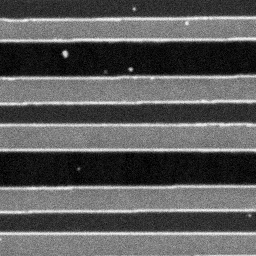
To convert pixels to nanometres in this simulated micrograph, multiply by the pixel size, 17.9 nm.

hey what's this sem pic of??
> lines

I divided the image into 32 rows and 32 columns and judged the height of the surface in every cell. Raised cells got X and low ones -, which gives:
XXXXXXXXXXXXXXXXXXXXXXXXXXXXXXXX
XXXXXXXXXXXXXXXXXXXXXXXXXXXXXXXX
XXXX----------------------------
--------------------------------
--------------------------------
XXXXXXXXXXXXXXXXXXXXXXXXXXXXXXXX
XXXXXXXXXXXXXXXXXXXXXXXXXXXXXXXX
XXXXXXXXXXXXXXXXXXXXXXXXXXXXXXXX
XXXXXXXXXXXXXXXXXXXXXXXXXXXXXXXX
XXXXXXXXXXXXXXXXXXXXXXXXXXXXXXXX
--------------------------------
--------------------------------
--------------------------------
XXXXXXXXXXXXXXXXXXXXXXXXXXXXXXXX
XXXXXXXXXXXXXXXXXXXXXXXXXXXXXXXX
XXXXXXXXXXXXXXXXXXXXXXXXXXXXXXXX
--------------------------------
--------------------------------
--------------------------------
XXXXXXXXXXXXXXXXXXXXXXXXXXXXXXXX
XXXXXXXXXXXXXXXXXXXXXXXXXXXXXXXX
XXXXXXXXXXXXXXXXXXXXXXXXXXXXXXXX
XXXXXXXXXXXXXXXXXXXXXXXXXXXXXXXX
XXXXXXXXX-----------------------
--------------------------------
--------------------------------
---XXXXXXXXXXXXXXXXXXXXXXXXXXXXX
XXXXXXXXXXXXXXXXXXXXXXXXXXXXXXXX
XXXXXXXXXXXXXXXXXXXXXXXXXXXXXXXX
--------------------------------
--------------------------------
--------------------------------